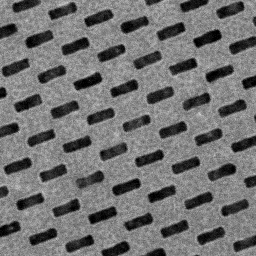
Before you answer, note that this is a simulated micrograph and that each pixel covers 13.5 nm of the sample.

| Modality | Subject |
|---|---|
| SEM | a regular array of holes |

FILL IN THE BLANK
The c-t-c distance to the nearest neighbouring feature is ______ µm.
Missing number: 0.491